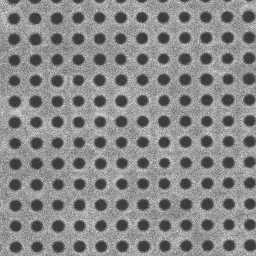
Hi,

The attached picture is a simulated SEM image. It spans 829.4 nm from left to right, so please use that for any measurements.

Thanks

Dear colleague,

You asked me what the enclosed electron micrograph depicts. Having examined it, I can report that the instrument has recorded a regular array of holes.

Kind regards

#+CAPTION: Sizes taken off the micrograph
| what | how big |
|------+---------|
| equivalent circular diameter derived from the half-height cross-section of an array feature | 36.5 nm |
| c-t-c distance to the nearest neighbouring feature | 0.0668 micrometres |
